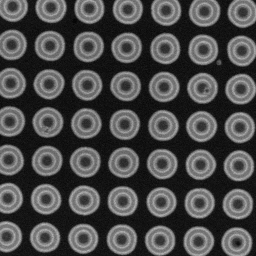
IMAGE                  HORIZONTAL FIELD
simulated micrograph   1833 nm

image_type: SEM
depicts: an array of small figures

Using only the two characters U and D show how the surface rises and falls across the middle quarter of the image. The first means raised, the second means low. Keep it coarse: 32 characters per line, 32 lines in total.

DDDDDDDDDDDDDDDDDDDDDDDDDDDDDDDD
DDDDDDDDDDDDDDDDDDDDDDDDDDDDDDDD
DDDUUUUUDDDDDUUUUUDDDDDUUUUDDDDD
DDUUUUUUUDDDUUUUUUUDDDUUUUUUDDDD
DDUUUUUUUDDDUUUUUUUDDUUUUUUUUDDU
DDUUUUUUUDDDUUUUUUUDDUUUUUUUUDDU
DDUUUUUUUDDDUUUUUUUDDUUUUUUUUDDU
DDDUUUUUUDDDUUUUUUUDDDUUUUUUDDDU
DDDDUUUUDDDDDUUUUUDDDDUUUUUUDDDD
DDDDDDDDDDDDDDDDDDDDDDDDDDDDDDDD
DDDDDDDDDDDDDDDDDDDDDDDDDDDDDDDD
DDDDUUUDDDDDDDUUDDDDDDDDDDDDDDDD
DDDUUUUUDDDDUUUUUUDDDDUUUUUDDDDD
DDUUUUUUUDDDUUUUUUUDDDUUUUUUDDDU
DDUUUUUUUDDDUUUUUUUDDUUUUUUUDDDU
DDUUUUUUUDDDUUUUUUUDDUUUUUUUUDDU
DDUUUUUUUDDDUUUUUUUDDUUUUUUUDDDU
DDDUUUUUDDDDUUUUUUDDDDUUUUUUDDDU
DDDDUUDDDDDDDUUUUDDDDDUUUUUDDDDD
DDDDDDDDDDDDDDDDDDDDDDDDDDDDDDDD
DDDDDDDDDDDDDDDDDDDDDDDDDDDDDDDD
DDDUUUUUDDDDDUUUUDDDDDDUUUDDDDDD
DDUUUUUUUDDDUUUUUUDDDDUUUUUDDDDD
DDUUUUUUUDDUUUUUUUUDDUUUUUUUDDDU
DUUUUUUUUDDUUUUUUUUDDUUUUUUUDDUU
DDUUUUUUUDDUUUUUUUUDDUUUUUUUDDUU
DDUUUUUUDDDUUUUUUUDDDUUUUUUUDDDU
DDDUUUUUDDDDUUUUUDDDDDUUUUUDDDDU
DDDDDDDDDDDDDDDDDDDDDDDUUUDDDDDD
DDDDDDDDDDDDDDDDDDDDDDDDDDDDDDDD
DDDDUUDDDDDDDDDDDDDDDDDDDDDDDDDD
DDUUUUUUDDDDUUUUUDDDDDUUUUUDDDDD